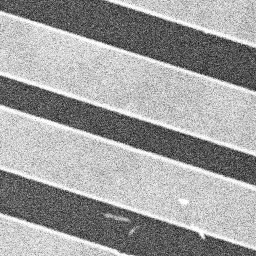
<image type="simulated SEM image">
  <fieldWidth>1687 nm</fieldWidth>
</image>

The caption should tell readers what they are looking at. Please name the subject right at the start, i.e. one or a few lines or trenches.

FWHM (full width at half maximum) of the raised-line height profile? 0.385 microns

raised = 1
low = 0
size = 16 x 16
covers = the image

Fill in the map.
0000000011111111
1100000000001111
1111110000000001
1111111110000000
1111111111110000
0001111111111110
0000001111111111
1110000001111111
1111110000001111
1111111110000000
1111111111110000
0001111111111110
0000001111111111
0000000000111111
1110000000000111
1111110000000000